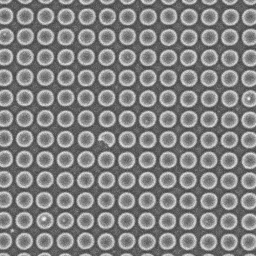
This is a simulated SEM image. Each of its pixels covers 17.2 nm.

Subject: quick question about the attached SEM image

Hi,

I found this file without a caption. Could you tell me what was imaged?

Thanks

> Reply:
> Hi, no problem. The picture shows a regular array of raised bodies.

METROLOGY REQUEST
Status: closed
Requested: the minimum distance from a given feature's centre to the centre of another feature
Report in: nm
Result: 347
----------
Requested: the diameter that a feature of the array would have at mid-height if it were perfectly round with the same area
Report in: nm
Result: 268